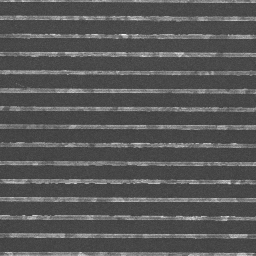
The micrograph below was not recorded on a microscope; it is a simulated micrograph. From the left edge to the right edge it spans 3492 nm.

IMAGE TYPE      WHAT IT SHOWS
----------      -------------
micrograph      parallel lines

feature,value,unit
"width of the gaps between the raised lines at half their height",198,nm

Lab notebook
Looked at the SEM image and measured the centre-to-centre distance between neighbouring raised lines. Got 247 nm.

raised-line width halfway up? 47.7 nm